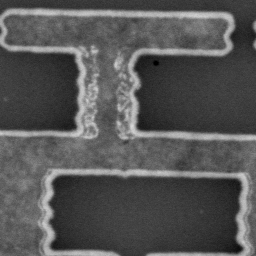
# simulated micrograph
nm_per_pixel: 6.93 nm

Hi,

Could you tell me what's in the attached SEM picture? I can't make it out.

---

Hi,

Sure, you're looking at one or a few lines or trenches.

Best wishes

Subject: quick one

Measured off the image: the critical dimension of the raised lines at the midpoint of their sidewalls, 264 nm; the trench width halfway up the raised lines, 569 nanometres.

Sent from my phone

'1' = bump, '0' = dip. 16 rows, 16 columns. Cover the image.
0000000000000000
1111111111111100
1111111111111100
0000011110000000
0000011100000000
0000011100000000
0000011100000000
0000011100000000
1111111111110000
1111111111111111
1111111111111111
1110000000000001
1110000000000001
1110000000000001
1110000000000001
1110000000000001